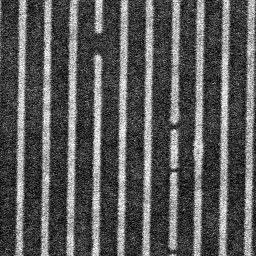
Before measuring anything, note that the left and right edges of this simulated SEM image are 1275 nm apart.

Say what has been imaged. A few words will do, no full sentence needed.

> parallel lines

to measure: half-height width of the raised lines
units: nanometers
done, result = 26.8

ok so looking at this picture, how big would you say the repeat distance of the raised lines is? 127 nm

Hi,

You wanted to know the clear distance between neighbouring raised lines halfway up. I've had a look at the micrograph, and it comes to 0.0997 µm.